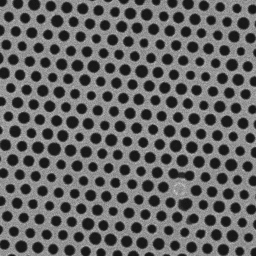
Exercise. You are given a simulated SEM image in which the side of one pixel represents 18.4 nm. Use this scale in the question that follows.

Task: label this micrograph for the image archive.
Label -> a regular array of holes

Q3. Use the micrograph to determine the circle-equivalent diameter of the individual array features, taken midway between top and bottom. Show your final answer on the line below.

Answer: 202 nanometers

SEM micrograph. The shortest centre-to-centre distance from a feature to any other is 15.8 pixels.